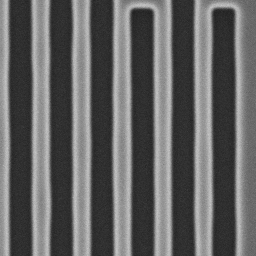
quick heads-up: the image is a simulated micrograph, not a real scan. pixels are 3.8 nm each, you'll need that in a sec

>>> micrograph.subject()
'groups of lines, slits or small figures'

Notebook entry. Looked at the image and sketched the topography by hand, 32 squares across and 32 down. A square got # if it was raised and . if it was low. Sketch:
#...##...##...#######...########
#...##...##...##...##...##...###
#...##...##...##...##...##....##
#...##...##...##...##...##....##
#...##...##...##...##...##....##
#...##...##...##...##...##....##
#...##...##...##...##...##....##
#...##...##...##...##...##....##
#...##...##...##...##...##....##
#...##...##...##...##...##....##
#...##...##...##...##...##....##
#...##...##...##...##...##....##
#...##...##...##...##...##....##
#...##...##...##...##...##....##
#...##...##...##...##....#....##
#...##...##...##...##....#....##
#...##...##...##...##....#....##
#...##...##...##...##...##....##
#...##...##...##...##...##....##
#...##...##...##...##...##....##
#...##...##...##...##...##....##
#...##...##...##...##...##....##
#...##...##...##...##...##....##
#...##...##...##...##...##....##
#...##...##...##...##...##....##
#...##...##...##...##...##....##
#...##...##...##...##...##....##
#...##...##...##...##...##....##
#...##...##...##...##...##....##
#...##...##...##...##....#....##
#...##...##...##...##....#....##
#...##...##...##...##....#....##